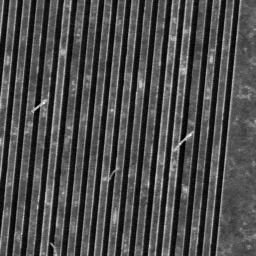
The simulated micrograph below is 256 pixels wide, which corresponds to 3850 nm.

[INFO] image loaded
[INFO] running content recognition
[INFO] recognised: parallel lines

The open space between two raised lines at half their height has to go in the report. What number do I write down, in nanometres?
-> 93.6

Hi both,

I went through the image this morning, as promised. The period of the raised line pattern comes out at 0.203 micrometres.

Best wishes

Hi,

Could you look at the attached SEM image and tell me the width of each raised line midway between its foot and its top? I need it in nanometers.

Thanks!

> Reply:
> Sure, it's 107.